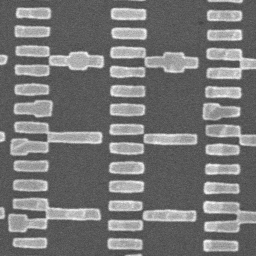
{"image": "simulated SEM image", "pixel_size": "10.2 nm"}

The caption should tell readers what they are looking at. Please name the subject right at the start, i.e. wiring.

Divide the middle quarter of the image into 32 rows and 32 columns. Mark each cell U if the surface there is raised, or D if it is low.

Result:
DUUUUUUUUUDDDDDDDDDDDUUUUUUUUUUU
DDDDDDDDDDDDUUUUUUUUDDDDDUUUUUDD
DDDDDDDDDDDDUUUUUUUUDDDDDDDDDDDD
DDDDDDDDDDDDDDDDDDDDDDDDDDDDDDDD
DDDDDDDDDDDDDDDDDDDDDDDDDDDDDDDD
DDDDDDDDDDDDDDDDDDDDDDDDDDDDDDDD
DDDDDDDDDDDDUUUUUUUUDDDDDDDDDDDD
DDDDDDDDDDDDUUUUUUUUDDDDDDDDDDDD
DDDDDDDDDDDDDDDDDDDDDDDDDDDDDDDD
DDDDDDDDDDDDDDDDDDDDDDDDDDDDDDDD
DDDDDDDDDDDDUUUUUUUUDDDDDDDDDDDD
DDDDDDDDDDDDUUUUUUUUDDDDDDDDDDDD
DDDDDDDDDDDDDUUUUUUUDDDDDDDDDDDD
DDDDDDDDDDDDDDDDDDDDDDDDDDDDDDDD
DDDDDDDDDDDDDDDDDDDDDDDDDDDDDDDD
DDDDDDDDDDDDUUUUUUUDDDDDDDDDDDDD
DDDDDDDDDDDDUUUUUUUUDDDDDDDDDDDD
UUUUUUUUUDDDDDDDDDDDDDDDDDDDDDDD
UUUUUUUUUDDDDDDDDDDDUUUUUUUUUUUU
UUUUUUUUUDDDDDDDDDDDUUUUUUUUUUUU
DDDDDDDDDDDDUUUUUUUUDDDDDDDDDDDD
DDDDDDDDDDDDUUUUUUUUDDDDDDDDDDDD
DDDDDDDDDDDDDDDUUDDDDDDDDDDDDDDD
DDDDDDDDDDDDDDDDDDDDDDDDDDDDDDDD
DDDDDDDDDDDDDDDDDDDDDDDDDDDDDDDD
DDDDDDDDDDDDUUUUUUUUDDDDDDDDDDDD
DDDDDDDDDDDUUUUUUUUUDDDDDDDDDDDD
DDDDDDDDDDDDDDDDDDDDDDDDDDDDDDDD
DDDDDDDDDDDDDDDDDDDDDDDDDDDDDDDD
DDDDDDDDDDDDUUUUUUDDDDDDDDDDDDDD
DDDDDDDDDDDUUUUUUUUUDDDDDDDDDDDD
DDDDDDDDDDDUUUUUUUUUDDDDDDDDDDDD